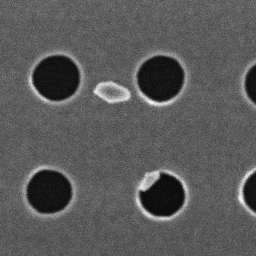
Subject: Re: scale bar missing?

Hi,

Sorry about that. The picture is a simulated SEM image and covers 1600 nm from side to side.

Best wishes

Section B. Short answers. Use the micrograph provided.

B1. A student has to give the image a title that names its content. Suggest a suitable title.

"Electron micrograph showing holes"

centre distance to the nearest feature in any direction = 0.682 micrometres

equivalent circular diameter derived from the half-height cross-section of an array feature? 0.287 microns